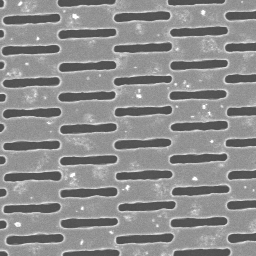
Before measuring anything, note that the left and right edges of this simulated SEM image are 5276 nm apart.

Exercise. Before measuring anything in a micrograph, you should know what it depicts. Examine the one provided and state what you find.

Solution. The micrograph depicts a regular array of holes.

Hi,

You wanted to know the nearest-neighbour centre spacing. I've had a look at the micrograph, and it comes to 642 nm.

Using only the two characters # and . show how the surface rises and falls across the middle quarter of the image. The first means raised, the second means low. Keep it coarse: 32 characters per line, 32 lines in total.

.............#############......
.......####################.####
################################
#############..............#####
############...............#####
################################
################################
.............##############.....
............###############.....
..##############################
##########################.#####
#############..............#####
#############.............######
################################
###############################.
.............##############.....
.............##############.....
...#############################
################################
#############..............#####
############..............######
################################
###############################.
.............##############.....
.............##############.....
################################
#####################.##########
#############..............#####
#############.............######
################################
################################
.............##############.....